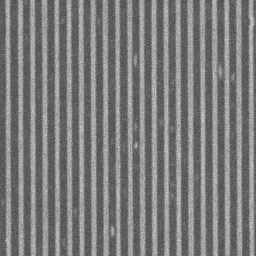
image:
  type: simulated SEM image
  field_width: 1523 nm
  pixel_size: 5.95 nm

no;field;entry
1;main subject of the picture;parallel lines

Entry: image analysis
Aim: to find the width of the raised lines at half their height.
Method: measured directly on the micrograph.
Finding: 17.9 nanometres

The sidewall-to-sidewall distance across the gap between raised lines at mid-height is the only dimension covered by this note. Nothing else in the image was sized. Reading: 53.6 nanometers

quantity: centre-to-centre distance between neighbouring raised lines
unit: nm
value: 72.4